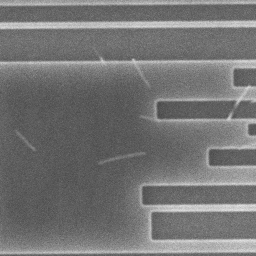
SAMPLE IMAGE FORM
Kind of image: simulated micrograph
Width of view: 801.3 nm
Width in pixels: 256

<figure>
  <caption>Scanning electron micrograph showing groups of lines, slits or small figures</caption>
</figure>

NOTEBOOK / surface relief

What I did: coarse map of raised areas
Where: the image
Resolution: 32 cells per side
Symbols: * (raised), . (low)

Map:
********........................
................................
................................
****............................
................................
................................
................................
................................
******************************..
*****************************...
*****************************...
********************************
***********************......*.*
*******************.............
********************............
*******************************.
*******************************.
********************************
****************************.**.
**************************......
**************************......
********************************
********************************
******************..............
******************..............
******************..............
*******************.............
*******************.............
*******************.............
*******************.............
********************************
*************************.......